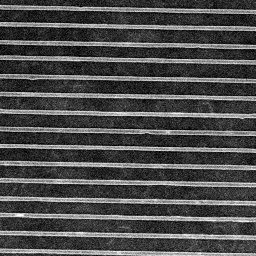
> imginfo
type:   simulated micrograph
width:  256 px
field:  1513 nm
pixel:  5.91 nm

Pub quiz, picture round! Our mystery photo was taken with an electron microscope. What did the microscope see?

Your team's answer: parallel lines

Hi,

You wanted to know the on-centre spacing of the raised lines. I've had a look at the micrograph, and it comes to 103 nanometres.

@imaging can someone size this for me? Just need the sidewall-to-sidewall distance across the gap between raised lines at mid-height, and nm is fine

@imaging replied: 79.1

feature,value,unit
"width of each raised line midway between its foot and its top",22.9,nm